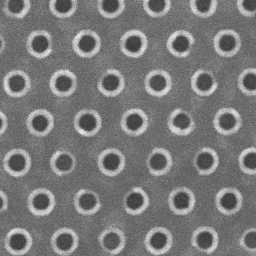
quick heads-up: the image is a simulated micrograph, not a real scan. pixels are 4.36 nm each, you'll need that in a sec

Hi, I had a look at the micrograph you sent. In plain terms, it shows a regular array of holes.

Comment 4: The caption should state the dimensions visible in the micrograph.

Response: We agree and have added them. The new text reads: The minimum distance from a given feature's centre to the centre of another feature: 198 nm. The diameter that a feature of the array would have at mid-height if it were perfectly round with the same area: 78.4 nm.